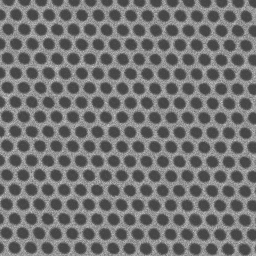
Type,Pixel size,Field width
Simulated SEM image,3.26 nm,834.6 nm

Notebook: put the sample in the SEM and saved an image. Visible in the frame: a regular array of holes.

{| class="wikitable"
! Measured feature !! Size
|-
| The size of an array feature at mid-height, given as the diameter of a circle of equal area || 37.1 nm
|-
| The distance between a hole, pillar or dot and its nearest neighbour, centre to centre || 0.0533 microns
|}